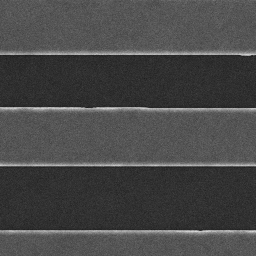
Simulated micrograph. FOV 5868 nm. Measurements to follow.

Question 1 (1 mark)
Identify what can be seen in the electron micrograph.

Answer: lines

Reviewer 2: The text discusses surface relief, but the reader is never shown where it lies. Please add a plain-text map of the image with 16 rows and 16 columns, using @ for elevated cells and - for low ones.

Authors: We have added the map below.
@@@@@@@@@@@@@@@@
@@@@@@@@@@@@@@@@
@@@@@@@@@@@@@@@@
----------------
----------------
----------------
----------------
@@@@@@@@@@@@@@@@
@@@@@@@@@@@@@@@@
@@@@@@@@@@@@@@@@
----------------
----------------
----------------
----------------
@@@@@@@@@@@@@@@@
@@@@@@@@@@@@@@@@